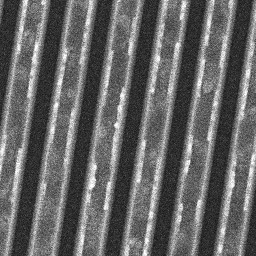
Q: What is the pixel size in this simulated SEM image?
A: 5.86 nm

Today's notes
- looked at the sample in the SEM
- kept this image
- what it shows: parallel lines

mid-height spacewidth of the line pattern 0.114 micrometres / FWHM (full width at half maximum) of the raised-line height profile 158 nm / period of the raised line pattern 0.27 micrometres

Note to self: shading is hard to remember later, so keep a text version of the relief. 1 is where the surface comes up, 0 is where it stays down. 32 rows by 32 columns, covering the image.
00011100111100111100111100111000
00011100111100111100111000111000
00111100111100111000111000111001
00111100111000111000111000111001
00111000111000111000111001111001
00111000111000111001111001111001
00111000111001111001111001110001
00111001111001111001110001110001
01111001111001110001110001110001
01111001110001110001110001110011
01110001110001110001110011110011
01110001110001110011110011110011
01110001110011110011110011100011
01110011110011110011110011100011
01110011110011100011100011100011
11110011110011100011100011100111
11110011100011100011100011100111
11100011100011100111100111100111
11100011100111100111100111000111
11100011100111100111100111000111
11100111100111100111000111000111
11100111100111000111000111000111
11100111000111000111000111001111
11000111000111000111001111001111
11000111000111001111001111001110
11000111001111001111001110001110
11001111001111001110001110001110
11001111001110001110001110001110
11001111001110001110001110011110
10001110001110001110011110011110
10001110001110011110011110011100
10001110001110011110011100011100